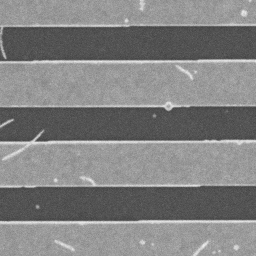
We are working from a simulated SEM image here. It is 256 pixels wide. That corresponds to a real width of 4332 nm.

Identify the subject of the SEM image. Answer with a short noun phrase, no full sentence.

lines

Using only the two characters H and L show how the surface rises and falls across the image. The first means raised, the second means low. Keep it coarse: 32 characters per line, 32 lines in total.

HHHHHHHHHHHHHHHHHHHHHHHHHHHHHHHH
HHHHHHHHHHHHHHHHHHHHHHHHHHHHHHHH
HHHHHHHHHHHHHHHHHHHHHHHHHHHHHHHH
LLLLLLLLLLLLLLLLLLLLLLLLLLLLLLLL
LLLLLLLLLLLLLLLLLLLLLLLLLLLLLLLL
LLLLLLLLLLLLLLLLLLLLLLLLLLLLLLLL
LLLLLLLLLLLLLLLLLLLLLLLLLLLLLLLL
LLLLLLLLLLLLLLLLLLLLLLLLLLLLLLLL
HHHHHHHHHHHHHHHHHHHHHHHHHHHHHHHH
HHHHHHHHHHHHHHHHHHHHHHHHHHHHHHHH
HHHHHHHHHHHHHHHHHHHHHHHHHHHHHHHH
HHHHHHHHHHHHHHHHHHHHHHHHHHHHHHHH
HHHHHHHHHHHHHHHHHHHHHHHHHHHHHHHH
LLLLLLLLLLLLLLLLLLLLHHLLLLLLLLLL
LLLLLLLLLLLLLLLLLLLLLLLLLLLLLLLL
LLLLLLLLLLLLLLLLLLLLLLLLLLLLLLLL
LLLLLLLLLLLLLLLLLLLLLLLLLLLLLLLL
LLLLLLLLLLLLLLLLLLLLLLLLLLLLLLLL
HHHHHHHHHHHHHHHHHHHHHHHHHHHHHHHH
HHHHHHHHHHHHHHHHHHHHHHHHHHHHHHHH
HHHHHHHHHHHHHHHHHHHHHHHHHHHHHHHH
HHHHHHHHHHHHHHHHHHHHHHHHHHHHHHHH
HHHHHHHHHHHHHHHHHHHHHHHHHHHHHHHH
LLLLLLLLLLLLLLLLLLLLLLLLLLLLLLLL
LLLLLLLLLLLLLLLLLLLLLLLLLLLLLLLL
LLLLLLLLLLLLLLLLLLLLLLLLLLLLLLLL
LLLLLLLLLLLLLLLLLLLLLLLLLLLLLLLL
LLLLLLLLLLLLLLLLLLLLLLLLLLLLLLLL
HHHHHHHHHHHHHHHHHHHHHHHHHHHHHHHH
HHHHHHHHHHHHHHHHHHHHHHHHHHHHHHHH
HHHHHHHHHHHHHHHHHHHHHHHHHHHHHHHH
HHHHHHHHHHHHHHHHHHHHHHHHHHHHHHHH